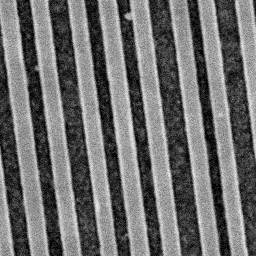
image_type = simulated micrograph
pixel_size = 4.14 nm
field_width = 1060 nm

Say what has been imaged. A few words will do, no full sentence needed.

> parallel lines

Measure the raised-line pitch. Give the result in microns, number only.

0.137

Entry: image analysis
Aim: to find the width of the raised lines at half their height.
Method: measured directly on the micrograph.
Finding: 69.8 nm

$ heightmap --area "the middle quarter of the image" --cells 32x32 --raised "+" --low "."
...++++....++++....++++......+++
...++++....++++....++++......+++
....+++....++++....++++......+++
....+++....+++++...++++......+++
....++++...+++++...+++++.....+++
....++++...+++++...+++++.....+++
....++++....++++...+++++.....+++
....++++....++++....++++.....+++
....++++....++++....++++......++
....++++....++++....++++......++
.....++++...+++++...++++......++
.....++++...+++++...++++......++
.....++++...+++++...+++++.....++
.....++++...+++++....++++.....++
.....++++....++++....++++......+
.....++++....++++....++++......+
.....++++....++++....++++......+
.....++++....++++....++++......+
.....++++....++++....++++......+
+.....++++...+++++...+++++.....+
+.....++++...+++++...+++++.....+
+.....++++....++++...+++++.....+
+.....++++....++++....++++......
+.....++++....++++....++++......
+.....++++....++++....++++......
+......+++....++++....++++......
+......++++...+++++...++++......
++.....++++...+++++...+++++.....
++.....++++...+++++...+++++.....
++.....++++....++++...+++++.....
++.....++++....++++....++++.....
++.....++++....++++....++++.....